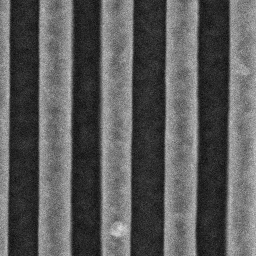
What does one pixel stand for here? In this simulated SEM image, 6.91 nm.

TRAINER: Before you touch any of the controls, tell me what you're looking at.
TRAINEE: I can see lines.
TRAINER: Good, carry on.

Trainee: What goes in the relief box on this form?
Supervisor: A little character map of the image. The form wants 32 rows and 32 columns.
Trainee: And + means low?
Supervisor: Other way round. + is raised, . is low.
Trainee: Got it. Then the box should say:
+....++++....++++....++++....+++
+....++++....++++....++++....+++
+....++++....++++....++++....+++
+....++++....++++....++++....+++
+....++++....++++....++++....+++
+....++++....++++....++++....+++
+....++++....++++....++++....+++
+....++++....+++.....++++....+++
+....++++....+++.....++++....+++
+....++++....+++.....++++....+++
+....++++....+++.....++++....+++
+....++++....+++.....++++....+++
+....++++....+++.....++++....+++
+....++++....+++.....++++....+++
+....++++....+++.....++++....+++
+....++++....+++.....++++....+++
+....++++....+++.....++++....+++
+....++++....+++.....++++....+++
+....++++....+++.....++++....+++
+....++++....+++.....++++....+++
+....++++....+++.....++++....+++
+....++++....+++.....++++....+++
+....++++....+++.....+++.....+++
+....++++....+++.....+++.....+++
+....++++....+++.....+++.....+++
+....++++....+++.....+++.....+++
+....++++....+++.....+++.....+++
+....++++....+++.....+++.....+++
+....++++....+++.....+++.....+++
+....++++....+++.....+++.....+++
+....++++....+++.....+++.....+++
+....++++....+++.....+++.....+++